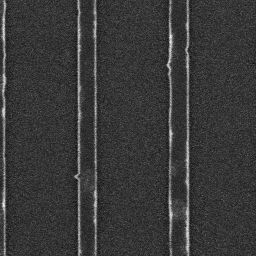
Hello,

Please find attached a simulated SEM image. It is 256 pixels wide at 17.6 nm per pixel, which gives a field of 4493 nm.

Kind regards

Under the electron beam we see one or a few lines or trenches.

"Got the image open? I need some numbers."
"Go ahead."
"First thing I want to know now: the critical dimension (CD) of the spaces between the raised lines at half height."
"1290 nm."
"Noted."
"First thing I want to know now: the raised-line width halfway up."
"310 nanometres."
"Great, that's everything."